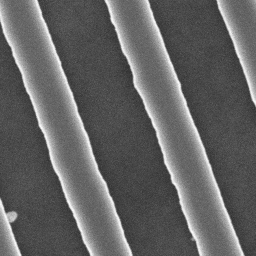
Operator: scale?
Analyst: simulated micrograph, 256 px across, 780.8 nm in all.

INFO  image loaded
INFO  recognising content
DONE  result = lines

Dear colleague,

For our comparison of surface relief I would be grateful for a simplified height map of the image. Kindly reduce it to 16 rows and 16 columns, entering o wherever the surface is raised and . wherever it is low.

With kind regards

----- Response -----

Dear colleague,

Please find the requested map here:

ooo....oo.....oo
ooo....ooo....oo
ooo....ooo.....o
.ooo....ooo....o
.ooo....ooo....o
..oo....ooo.....
..ooo....ooo....
..ooo....ooo....
...oo.....oo....
...ooo....ooo...
...ooo....ooo...
....ooo....ooo..
....ooo....ooo..
.....oo.....oo..
o....ooo....ooo.
o....ooo....ooo.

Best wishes